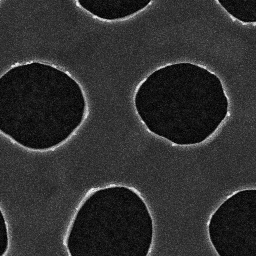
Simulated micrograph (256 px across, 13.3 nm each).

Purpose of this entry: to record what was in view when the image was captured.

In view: holes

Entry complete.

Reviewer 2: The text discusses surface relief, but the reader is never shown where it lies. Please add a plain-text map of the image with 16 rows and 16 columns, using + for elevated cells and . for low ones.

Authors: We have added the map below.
+++++....+++++..
++++++++++++++++
++++++++++++++++
++++++++++++++++
....++++++...+++
.....++++.....++
.....+++......++
.....++++.....++
+...++++++...+++
++++++++++++++++
++++++++++++++++
++++++++++++++++
+++++....+++++..
+++++....++++...
++++......+++...
++++.....++++...